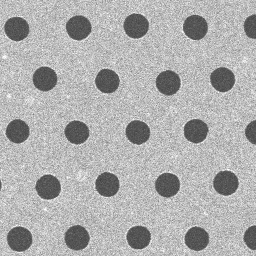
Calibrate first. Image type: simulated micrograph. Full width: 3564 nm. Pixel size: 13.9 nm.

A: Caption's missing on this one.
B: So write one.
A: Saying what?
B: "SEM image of a regular array of holes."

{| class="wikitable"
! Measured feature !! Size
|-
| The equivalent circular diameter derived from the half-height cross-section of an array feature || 25.1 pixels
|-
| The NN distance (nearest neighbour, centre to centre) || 58.1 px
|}